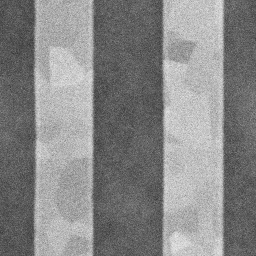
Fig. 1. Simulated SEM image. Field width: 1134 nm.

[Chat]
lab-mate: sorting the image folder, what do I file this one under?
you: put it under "one or a few lines or trenches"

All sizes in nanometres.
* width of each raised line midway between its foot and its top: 241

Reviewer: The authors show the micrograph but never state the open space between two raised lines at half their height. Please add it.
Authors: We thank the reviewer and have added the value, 0.333 micrometres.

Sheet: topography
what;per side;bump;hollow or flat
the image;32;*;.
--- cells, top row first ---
.....******..........*******....
.....******..........*******....
.....******..........*******....
.....******..........*******....
.....******..........*******....
.....******..........*******....
.....******..........*******....
.....******..........*******....
.....******..........*******....
.....******..........*******....
.....******..........*******....
.....******..........*******....
.....******..........*******....
.....******..........*******....
.....******..........*******....
.....******..........*******....
.....******..........*******....
.....******..........*******....
.....******..........*******....
.....******..........*******....
.....******..........*******....
.....******..........*******....
.....******..........*******....
.....******..........*******....
.....******..........*******....
.....******..........*******....
.....******..........*******....
.....******..........*******....
.....******..........*******....
.....******..........*******....
.....******..........*******....
.....******..........*******....